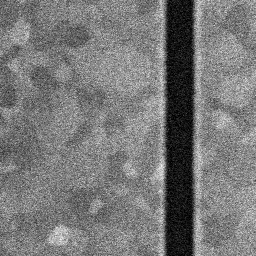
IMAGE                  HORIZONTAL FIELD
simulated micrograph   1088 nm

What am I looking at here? one or a few lines or trenches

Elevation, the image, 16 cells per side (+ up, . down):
++++++++++..++++
++++++++++..++++
++++++++++..++++
++++++++++..++++
++++++++++..++++
++++++++++..++++
++++++++++..++++
++++++++++..++++
++++++++++..++++
++++++++++..++++
++++++++++..++++
++++++++++..++++
++++++++++..++++
++++++++++..++++
++++++++++..++++
++++++++++..++++